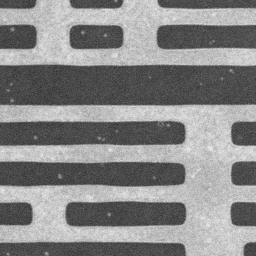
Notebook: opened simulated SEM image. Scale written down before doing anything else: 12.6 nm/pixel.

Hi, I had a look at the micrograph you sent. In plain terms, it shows groups of lines, slits or small figures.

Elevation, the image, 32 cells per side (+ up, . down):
.....++++......+++++............
++++++++++++++++++++++++++++++++
++++++++++++++++++++++++++++++++
....+++++......+++++............
.....++++.......+++.............
.....++++......+++++............
++++++++++++++++++++++++++++++++
++++++++++++++++++++++++++++++++
................................
................................
................................
................................
................................
++++++++++++++++++++++++++++++++
++++++++++++++++++++++++++++++++
.......................++++++...
.......................++++++...
.......................++++++...
++++++++++++++++++++++++++++++++
++++++++++++++++++++++++++++++++
.......................++++++...
.......................++++++...
.......................++++++...
++++++++++++++++++++++++++++++++
++++++++++++++++++++++++++++++++
....++++...............++++++...
....++++...............++++++...
....++++...............++++++...
++++++++++++++++++++++++++++++++
++++++++++++++++++++++++++++++++
.......................++++++++.
.......................+++++++..